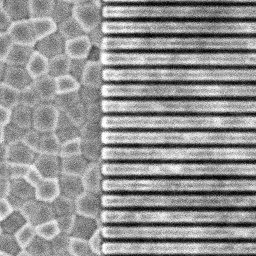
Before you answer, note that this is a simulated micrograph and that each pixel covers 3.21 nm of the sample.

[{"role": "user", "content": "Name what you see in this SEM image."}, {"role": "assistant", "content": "parallel lines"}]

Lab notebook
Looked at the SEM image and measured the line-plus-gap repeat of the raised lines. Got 0.0507 microns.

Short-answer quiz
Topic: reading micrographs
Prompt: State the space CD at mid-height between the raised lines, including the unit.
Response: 16.9 nm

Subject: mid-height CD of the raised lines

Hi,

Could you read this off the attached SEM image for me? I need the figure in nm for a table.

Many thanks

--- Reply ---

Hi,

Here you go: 33.7